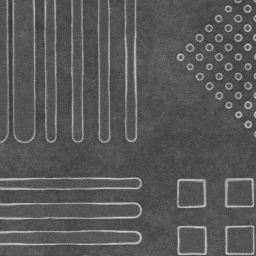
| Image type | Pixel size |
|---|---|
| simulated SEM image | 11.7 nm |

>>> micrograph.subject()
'groups of lines, slits or small figures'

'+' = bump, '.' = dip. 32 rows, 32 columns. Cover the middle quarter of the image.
..+++....++.....++.............+
..+++....++.....++..............
..+++....++.....++..............
..+++....++.....++..............
..+++....++.....++..............
..+++....++.....++..............
..+++....++.....++..............
..++.....++.....++..............
..++.....++....+++..............
..++.....++....+++..............
..++.....++....+++..............
..++.....++.....++..............
..+++....++.....++..............
..+++....++....+++..............
..+++....++....+++..............
..+++....++....+++..............
..+++....++....+++..............
..+++....++.....++..............
..+++....++.....++..............
................................
................................
................................
................................
................................
................................
................................
................................
................................
................................
+++++++++++++++++++..........+++
+++++++++++++++++++..........+++
.............................+++